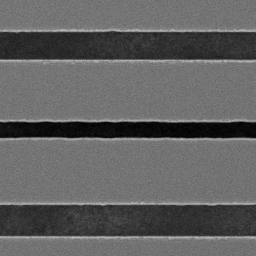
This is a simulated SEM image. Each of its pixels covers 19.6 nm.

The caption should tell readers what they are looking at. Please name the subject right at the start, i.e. lines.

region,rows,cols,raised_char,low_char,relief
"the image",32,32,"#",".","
################################
################################
################################
################################
................................
................................
................................
................................
################################
################################
################################
################################
################################
################################
################################
................................
................................
################################
################################
################################
################################
################################
################################
################################
################################
################################
................................
................................
................................
................................
################################
################################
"